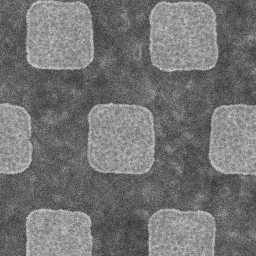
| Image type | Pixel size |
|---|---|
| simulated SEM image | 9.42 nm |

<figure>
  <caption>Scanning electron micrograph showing raised bodies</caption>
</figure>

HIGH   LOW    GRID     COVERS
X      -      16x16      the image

--XXX-----XXX---
--XXXX---XXXX---
--XXXX---XXXXX--
--XXXX---XXXXX--
----------------
----------------
----------------
XX----XXXX---XXX
XX----XXXX---XXX
XX----XXXX---XXX
XX----XXX-----XX
----------------
----------------
--XXX-----XXX---
--XXXX---XXXX---
--XXXX---XXXX---